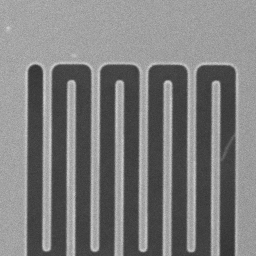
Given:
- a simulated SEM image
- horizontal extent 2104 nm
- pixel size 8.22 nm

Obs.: groups of lines, slits or small figures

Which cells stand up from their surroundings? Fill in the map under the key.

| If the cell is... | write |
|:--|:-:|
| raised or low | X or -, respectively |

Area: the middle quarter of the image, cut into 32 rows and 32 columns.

------XXXX--------XXXX--------XX
-------XX----------XX----------X
-------XX----------XX----------X
-------XX----------XX----------X
-X-----XX----X-----XX----XX----X
-XX----XX----XX----XX----XX----X
-XX----XX----XX----XX----XX----X
-XX----XX----XX----XX----XX----X
-XX----XX----XX----XX----XX----X
-XX----XX----XX----XX----XX----X
-XX----XX----XX----XX----XX----X
-XX----XX----XX----XX----XX----X
-XX----XX----XX----XX----XX----X
-XX----XX----XX----XX----XX----X
-XX----XX----XX----XX----XX----X
-XX----XX----XX----XX----XX----X
-XX----XX----XX----XX----XX----X
-XX----XX----XX----XX----XX----X
-XX----XX----XX----XX----XX----X
-XX----XX----XX----XX----XX----X
-XX----XX----XX----XX----XX----X
-XX----XX----XX----XX----XX----X
-XX----XX----XX----XX----XX----X
-XX----XX----XX----XX----XX----X
-XX----XX----XX----XX----XX----X
-XX----XX----XX----XX----XX----X
-XX----XX----XX----XX----XX----X
-XX----XX----XX----XX----XX----X
-XX----XX----XX----XX----XX----X
-XX----XX----XX----XX----XX----X
-XX----XX----XX----XX----XX----X
-XX----XX----XX----XX----XX----X